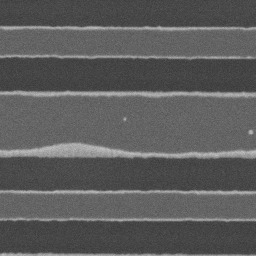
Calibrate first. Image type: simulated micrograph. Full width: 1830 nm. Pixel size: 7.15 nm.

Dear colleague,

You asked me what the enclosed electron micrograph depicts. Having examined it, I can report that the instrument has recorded lines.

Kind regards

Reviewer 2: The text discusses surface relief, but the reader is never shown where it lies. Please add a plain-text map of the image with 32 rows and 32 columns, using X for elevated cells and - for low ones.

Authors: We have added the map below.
--------------------------------
--------------------------------
--------------------------------
XXXXXXXXXXXXXXXXXXXXXXXXXXXXXXXX
XXXXXXXXXXXXXXXXXXXXXXXXXXXXXXXX
XXXXXXXXXXXXXXXXXXXXXXXXXXXXXXXX
XXXXXXXXXXXXXXXXXXXXXXXXXXXXXXXX
--------------------------------
--------------------------------
--------------------------------
--------------------------------
--------------------------------
XXXXXXXXXXXXXXXXXXXXXXXXXXXXXXXX
XXXXXXXXXXXXXXXXXXXXXXXXXXXXXXXX
XXXXXXXXXXXXXXXXXXXXXXXXXXXXXXXX
XXXXXXXXXXXXXXXXXXXXXXXXXXXXXXXX
XXXXXXXXXXXXXXXXXXXXXXXXXXXXXXXX
XXXXXXXXXXXXXXXXXXXXXXXXXXXXXXXX
XXXXXXXXXXXXXXXXXXXXXXXXXXXXXXXX
------------------XXXXXXXXXX----
--------------------------------
--------------------------------
--------------------------------
--------------------------------
XXXXXXXXXXXXXXXXXXXXXXXXXXXXXXXX
XXXXXXXXXXXXXXXXXXXXXXXXXXXXXXXX
XXXXXXXXXXXXXXXXXXXXXXXXXXXXXXXX
XX-X-XXXXXXXXXXXXXXXXXXXXXXXXXXX
--------------------------------
--------------------------------
--------------------------------
--------------------------------